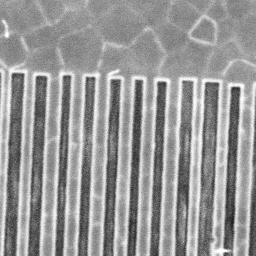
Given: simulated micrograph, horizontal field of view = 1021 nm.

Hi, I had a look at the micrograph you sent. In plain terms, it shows parallel lines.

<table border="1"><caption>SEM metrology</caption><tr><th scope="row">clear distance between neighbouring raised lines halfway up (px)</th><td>11.9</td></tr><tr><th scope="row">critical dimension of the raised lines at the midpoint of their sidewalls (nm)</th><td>51.3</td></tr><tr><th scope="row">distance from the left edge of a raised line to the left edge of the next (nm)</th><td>96.8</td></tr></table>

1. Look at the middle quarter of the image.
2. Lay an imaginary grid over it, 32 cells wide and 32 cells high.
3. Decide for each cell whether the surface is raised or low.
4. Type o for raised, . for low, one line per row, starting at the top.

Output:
oooooooooooooooooooooooooooooooo
oooooooooooooooooooooooooooooooo
oooooooooooooooooooooooooooooooo
..ooo...ooooo.oooooooooooooooooo
..ooo...ooo...ooo...ooo...ooo...
..ooo...ooo...ooo...ooo...ooo...
..ooo...ooo...ooo...ooo...ooo...
..ooo...ooo...ooo...ooo...ooo...
..ooo...ooo...ooo...ooo...ooo...
..ooo...ooo...ooo...ooo...ooo...
..ooo...ooo...ooo...ooo...ooo...
..ooo...ooo...ooo...ooo...ooo...
..ooo...ooo...ooo...ooo...ooo...
..ooo...ooo...ooo...ooo...ooo...
..ooo...ooo...ooo...ooo..oooo...
..ooo...ooo...ooo...oo...oooo...
..ooo..oooo...ooo..ooo...oooo...
.ooo...oooo...ooo...oo...oooo...
.ooo...oooo...ooo...oo...oooo...
.ooo...oooo...ooo...ooo..oooo...
.ooo....ooo...ooo..ooo...ooo....
.ooo...oooo...oo...ooo...ooo....
.ooo...ooo....ooo..ooo...ooo....
.ooo...oooo...ooo..ooo...ooo....
.ooo...ooo....ooo..ooo...ooo....
.ooo...ooo....ooo..ooo...ooo....
.ooo...ooo...ooo...ooo...ooo....
.ooo...ooo...ooo...ooo...ooo....
.ooo...ooo...ooo...ooo...ooo....
.ooo...ooo...ooo...ooo...ooo....
.ooo...ooo...ooo...ooo...ooo....
.ooo...ooo...ooo...ooo...ooo....